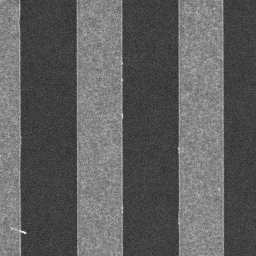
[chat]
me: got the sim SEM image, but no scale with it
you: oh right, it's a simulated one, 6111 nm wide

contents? one or a few lines or trenches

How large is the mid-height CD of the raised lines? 1050 nanometers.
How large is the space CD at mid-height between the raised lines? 1380 nm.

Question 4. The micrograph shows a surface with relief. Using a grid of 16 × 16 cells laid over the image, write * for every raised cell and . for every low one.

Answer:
*....***...***..
*....***...***..
*....***...***..
*....***...***..
*....***...***..
*....***...***..
*....***...***..
*....***...***..
*....***...***..
*....***...***..
*....***...***..
*....***...***..
*....***...***..
*....***...***..
*....***...***..
*....***...***..